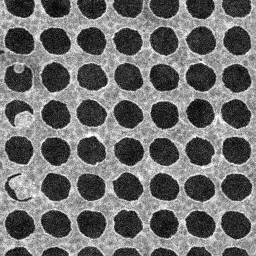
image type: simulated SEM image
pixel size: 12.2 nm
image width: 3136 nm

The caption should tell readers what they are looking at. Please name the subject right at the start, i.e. a regular array of holes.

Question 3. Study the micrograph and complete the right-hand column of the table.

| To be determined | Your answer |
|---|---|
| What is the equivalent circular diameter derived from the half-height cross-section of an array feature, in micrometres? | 0.362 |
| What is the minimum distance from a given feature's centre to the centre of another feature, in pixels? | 35.6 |